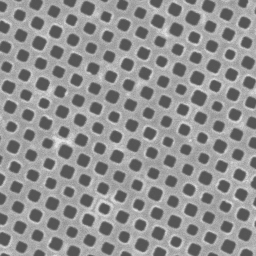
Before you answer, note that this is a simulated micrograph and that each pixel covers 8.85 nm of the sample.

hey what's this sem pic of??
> a regular array of holes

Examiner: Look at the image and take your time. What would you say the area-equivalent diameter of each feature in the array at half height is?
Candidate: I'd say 111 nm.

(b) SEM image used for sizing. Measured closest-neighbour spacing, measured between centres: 19.5 pixels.